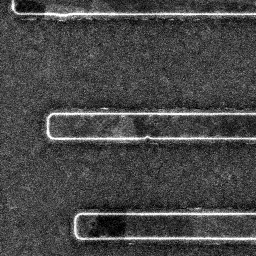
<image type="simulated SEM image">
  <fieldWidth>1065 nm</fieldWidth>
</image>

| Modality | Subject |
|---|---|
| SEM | one or a few lines or trenches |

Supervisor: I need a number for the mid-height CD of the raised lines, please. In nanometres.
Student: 103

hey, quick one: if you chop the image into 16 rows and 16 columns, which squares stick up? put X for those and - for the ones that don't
-XXXXXXXXXXXXXXX
----------------
----------------
----------------
----------------
----------------
----------------
---XXXXXXXXXXXXX
---XXXXXXXXXXXXX
----------------
----------------
----------------
----------------
-----XXXXXXXXXXX
-----XXXXXXXXXXX
----------------